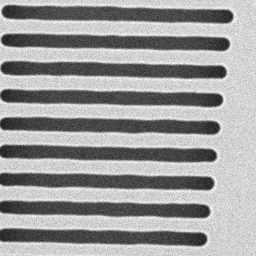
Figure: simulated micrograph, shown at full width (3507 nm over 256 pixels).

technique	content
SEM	groups of lines, slits or small figures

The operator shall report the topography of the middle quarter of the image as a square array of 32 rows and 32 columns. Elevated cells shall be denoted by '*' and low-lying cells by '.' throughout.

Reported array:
................................
................................
................................
*****************...............
********************************
********************************
......**************************
................................
................................
................................
***************.**..............
********************************
********************************
...........*********************
................................
................................
................................
***************.....****........
********************************
********************************
..............******************
................................
................................
................................
***********************.........
********************************
********************************
..........*****..***************
................................
................................
................................
************************.....**.